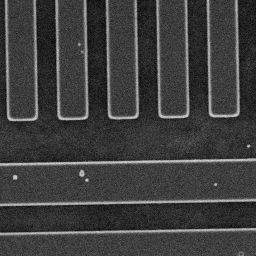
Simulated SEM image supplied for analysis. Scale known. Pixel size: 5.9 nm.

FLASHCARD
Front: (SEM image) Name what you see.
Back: groups of lines, slits or small figures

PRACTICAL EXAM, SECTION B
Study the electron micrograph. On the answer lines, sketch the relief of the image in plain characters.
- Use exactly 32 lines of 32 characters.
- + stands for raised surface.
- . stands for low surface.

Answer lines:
.+++...++++..++++...+++...++++..
.+++...++++..++++...+++...++++..
.+++...++++..++++...+++...++++..
.+++...++++..++++...+++...++++..
.+++...++++..++++...+++...++++..
.+++...++++..++++...+++...++++..
.+++...++++..++++...+++...++++..
.+++...++++...+++...+++...++++..
.++++..++++...+++...+++...++++..
.++++..++++...+++...+++...++++..
.++++..++++...+++...+++...++++..
.++++..++++...+++...+++...++++..
.++++..++++...+++...+++...++++..
.++++..++++...+++...+++...++++..
.++++...+++...+++...+++.........
................................
................................
................................
................................
................................
......++++++++++++++++++++++++++
++++++++++++++++++++++++++++++++
++++++++++++++++++++++++++++++++
++++++++++++++++++++++++++++++++
++++++++++++++++++++++++++++++++
++++++..........................
................................
................................
................................
++++++++++++++++++++++++++++++++
++++++++++++++++++++++++++++++++
++++++++++++++++++++++++++++++++